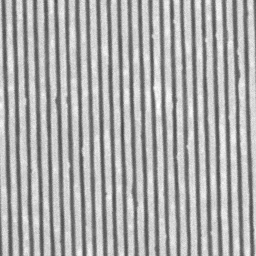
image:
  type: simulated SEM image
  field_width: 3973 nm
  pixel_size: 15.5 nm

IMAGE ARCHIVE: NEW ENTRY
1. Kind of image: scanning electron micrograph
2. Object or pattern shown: parallel lines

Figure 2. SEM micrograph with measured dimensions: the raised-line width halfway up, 97 nm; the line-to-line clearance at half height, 69.8 nanometers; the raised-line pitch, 163 nanometres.